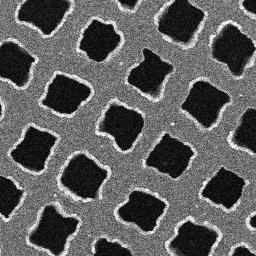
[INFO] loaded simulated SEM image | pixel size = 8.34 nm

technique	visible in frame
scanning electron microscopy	a regular array of holes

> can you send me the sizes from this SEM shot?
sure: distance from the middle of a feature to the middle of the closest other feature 496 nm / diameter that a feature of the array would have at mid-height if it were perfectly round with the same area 39.5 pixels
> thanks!